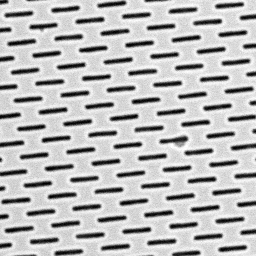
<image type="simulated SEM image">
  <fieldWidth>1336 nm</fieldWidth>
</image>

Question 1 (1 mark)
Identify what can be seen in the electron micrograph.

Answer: a regular array of holes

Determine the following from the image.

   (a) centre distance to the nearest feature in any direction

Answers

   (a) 141 nanometers